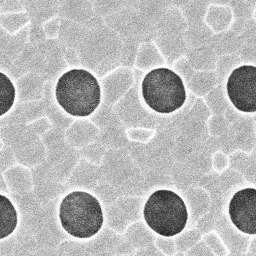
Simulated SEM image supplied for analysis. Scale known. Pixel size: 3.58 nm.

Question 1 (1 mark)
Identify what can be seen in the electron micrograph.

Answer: holes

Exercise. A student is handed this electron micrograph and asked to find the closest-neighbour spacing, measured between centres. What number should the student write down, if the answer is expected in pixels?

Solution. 85.2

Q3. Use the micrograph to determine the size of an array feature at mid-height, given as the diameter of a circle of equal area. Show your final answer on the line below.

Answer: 165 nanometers